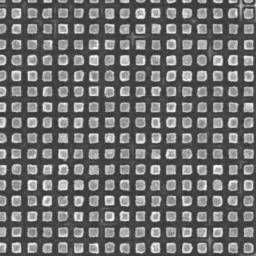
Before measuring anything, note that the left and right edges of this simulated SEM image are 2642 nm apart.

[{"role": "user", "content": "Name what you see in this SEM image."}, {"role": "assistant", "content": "a regular array of raised bodies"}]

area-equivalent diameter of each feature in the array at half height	0.104	microns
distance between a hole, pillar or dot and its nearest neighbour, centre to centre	157	nm